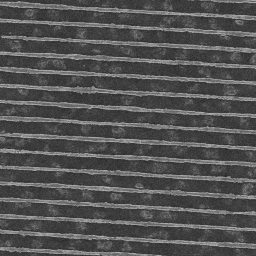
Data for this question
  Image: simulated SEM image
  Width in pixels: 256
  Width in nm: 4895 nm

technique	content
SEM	parallel lines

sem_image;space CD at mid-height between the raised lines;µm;0.26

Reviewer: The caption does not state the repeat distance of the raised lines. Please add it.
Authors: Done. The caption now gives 311 nm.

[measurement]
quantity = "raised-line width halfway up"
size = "50.1 nm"